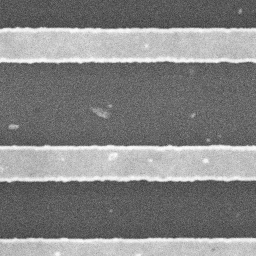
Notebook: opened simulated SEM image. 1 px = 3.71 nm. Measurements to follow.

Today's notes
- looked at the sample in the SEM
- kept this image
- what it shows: lines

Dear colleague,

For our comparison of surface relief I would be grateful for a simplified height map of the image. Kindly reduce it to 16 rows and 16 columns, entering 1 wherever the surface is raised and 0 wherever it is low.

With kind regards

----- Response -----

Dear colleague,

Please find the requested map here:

0000000000000000
0000000000000000
1111111111111111
1111111111111111
0000000000000000
0000000000000000
0000000000000000
0000000000000000
0000000000000000
1111111111111111
1111111111111111
0000000000000000
0000000000000000
0000000000000000
0000000000000000
1111111111111111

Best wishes